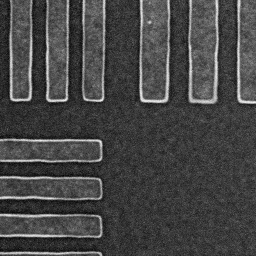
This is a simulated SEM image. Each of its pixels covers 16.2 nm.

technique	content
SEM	groups of lines, slits or small figures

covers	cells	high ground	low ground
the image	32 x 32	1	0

01110011100110000011100011100011
01110011001110000011100011100011
01110011001110000011100011100011
01110011001110000011100011100011
01110011000110000011100011100011
01110011001110000011100011100011
01110011001110000011100011100011
01110011001110000011100011100011
01110011001110000011100011100011
01110011001110000011100011100011
01110011001110000011100011100011
01110011001110000011100011100011
00000011000100000011000011100011
00000000000000000000000000000000
00000000000000000000000000000000
00000000000000000000000000000000
00000000000000000000000000000000
00000000000000000000000000000000
11111111111110000000000000000000
11111111111110000000000000000000
00000000000000000000000000000000
00000000000000000000000000000000
11111111111100000000000000000000
11111111111110000000000000000000
11111111111110000000000000000000
00000000000000000000000000000000
00000000000000000000000000000000
11111111111110000000000000000000
11111111111110000000000000000000
00000000111100000000000000000000
00000000000000000000000000000000
00000000000000000000000000000000